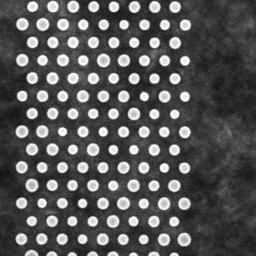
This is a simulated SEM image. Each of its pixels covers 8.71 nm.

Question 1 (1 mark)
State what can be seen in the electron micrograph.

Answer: a regular array of raised bodies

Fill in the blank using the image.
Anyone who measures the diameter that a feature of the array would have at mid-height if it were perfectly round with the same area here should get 10.5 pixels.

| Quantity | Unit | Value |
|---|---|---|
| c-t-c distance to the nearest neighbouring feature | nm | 176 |